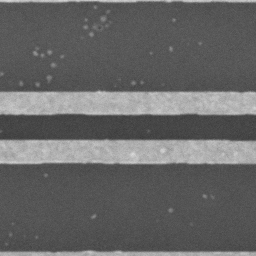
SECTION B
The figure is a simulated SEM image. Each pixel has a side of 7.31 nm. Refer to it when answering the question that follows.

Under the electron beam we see lines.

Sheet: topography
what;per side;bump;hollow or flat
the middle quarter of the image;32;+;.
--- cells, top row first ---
................................
................................
................................
................................
................................
................................
................................
++++++++++++++++++++++++++++++++
++++++++++++++++++++++++++++++++
++++++++++++++++++++++++++++++++
++++++++++++++++++++++++++++++++
++++++++++++++++++++++++++++++++
................................
................................
................................
................................
................................
................................
................................
++++++++++++++++++++++++++++++++
++++++++++++++++++++++++++++++++
++++++++++++++++++++++++++++++++
++++++++++++++++++++++++++++++++
++++++++++++++++++++++++++++++++
++++++++++++++++++++++++++++++++
................................
................................
................................
................................
................................
................................
................................